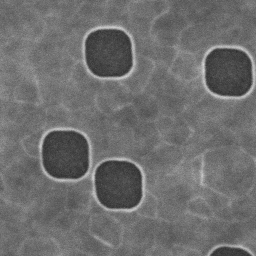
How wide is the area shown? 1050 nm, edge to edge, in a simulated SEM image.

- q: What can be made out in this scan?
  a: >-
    holes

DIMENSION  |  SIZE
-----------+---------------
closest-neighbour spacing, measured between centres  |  351 nanometers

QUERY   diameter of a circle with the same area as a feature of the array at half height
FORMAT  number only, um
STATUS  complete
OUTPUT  0.212